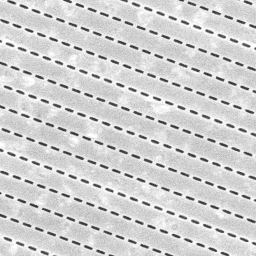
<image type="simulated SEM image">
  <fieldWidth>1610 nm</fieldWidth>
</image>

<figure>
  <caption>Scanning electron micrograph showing a regular array of holes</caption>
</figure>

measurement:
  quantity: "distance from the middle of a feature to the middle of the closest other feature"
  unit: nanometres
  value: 81.5